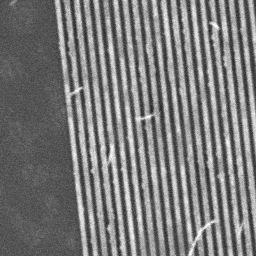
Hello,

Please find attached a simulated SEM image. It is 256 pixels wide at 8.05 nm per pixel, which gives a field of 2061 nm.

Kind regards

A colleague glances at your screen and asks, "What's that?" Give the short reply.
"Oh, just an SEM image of parallel lines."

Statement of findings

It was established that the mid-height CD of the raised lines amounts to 29 nm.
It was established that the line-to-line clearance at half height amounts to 43 nm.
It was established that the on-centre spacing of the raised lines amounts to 77.3 nanometres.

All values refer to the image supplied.